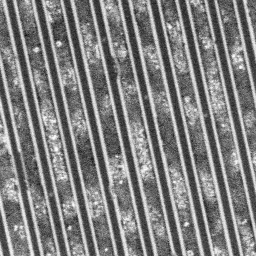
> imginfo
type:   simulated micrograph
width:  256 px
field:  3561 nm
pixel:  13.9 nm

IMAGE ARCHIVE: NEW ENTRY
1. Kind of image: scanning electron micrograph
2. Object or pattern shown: parallel lines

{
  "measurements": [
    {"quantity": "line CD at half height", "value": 0.139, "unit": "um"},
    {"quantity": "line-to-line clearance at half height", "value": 241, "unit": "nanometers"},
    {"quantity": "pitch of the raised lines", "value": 0.389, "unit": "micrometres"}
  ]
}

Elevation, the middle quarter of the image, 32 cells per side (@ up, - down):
---@@-----@@@----@@@----@@@-----
---@@@----@@@@---@@@-----@@-----
---@@@-----@@@----@@-----@@@----
---@@@-----@@@----@@@----@@@----
----@@-----@@@----@@@----@@@----
----@@@----@@@----@@@-----@@----
----@@@-----@@-----@@-----@@----
----@@@-----@@-----@@-----@@@---
-----@@-----@@-----@@@----@@@---
-----@@-----@@@----@@@----@@@---
-----@@@----@@@----@@@-----@@---
@----@@@-----@@-----@@-----@@@--
@----@@@-----@@-----@@@----@@@--
@-----@@-----@@@----@@@----@@@--
@-----@@-----@@@----@@@----@@@--
@-----@@@----@@@----@@@-----@@--
@@----@@@-----@@-----@@-----@@@-
@@-----@@-----@@-----@@@----@@@-
@@-----@@-----@@@----@@@----@@@-
@@-----@@@----@@@----@@@-----@@-
@@@----@@@-----@@-----@@-----@@-
@@@-----@@-----@@-----@@-----@@@
-@@-----@@-----@@-----@@@----@@@
-@@-----@@-----@@@----@@@----@@@
-@@-----@@@----@@@-----@@-----@@
-@@@----@@@-----@@-----@@-----@@
-@@@-----@@-----@@-----@@@----@@
--@@-----@@-----@@@----@@@----@@
--@@-----@@@----@@@----@@@----@@
--@@-----@@@----@@@----@@@-----@
--@@@----@@@-----@@-----@@-----@
--@@@-----@@-----@@-----@@@----@